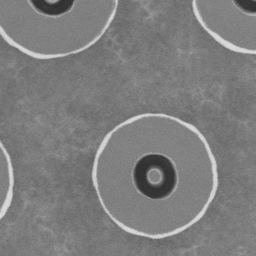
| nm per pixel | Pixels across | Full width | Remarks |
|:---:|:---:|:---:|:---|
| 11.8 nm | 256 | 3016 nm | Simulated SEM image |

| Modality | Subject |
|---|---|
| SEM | ring-shaped raised bodies with a dot in the middle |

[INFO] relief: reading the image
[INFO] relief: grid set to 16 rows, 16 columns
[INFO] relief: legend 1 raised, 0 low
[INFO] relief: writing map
1100111000001110
1111111000000111
0111110000000011
0011000000000000
0000000000000000
0000000000000000
0000000000000000
0000000011100000
0000000111111000
0000001111111000
1000001100011000
1000001100011000
1000001111111000
0000000111110000
0000000011100000
0000000000000000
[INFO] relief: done